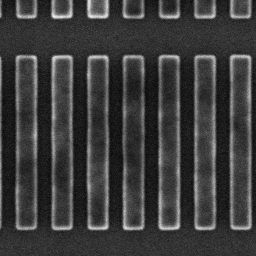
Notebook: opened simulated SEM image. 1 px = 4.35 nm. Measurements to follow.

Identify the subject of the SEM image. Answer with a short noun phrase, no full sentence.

groups of lines, slits or small figures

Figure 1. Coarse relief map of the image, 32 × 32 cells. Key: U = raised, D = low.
DDUUDDDUUDDUUDDDUUDDUUDDUUUDDUUD
DDUUDDDUUDDUUDDDUUDDUUDDUUUDDUUD
DDDDDDDDDDDDDDDDDDDDDDDDDDDDDDDD
DDDDDDDDDDDDDDDDDDDDDDDDDDDDDDDD
DDDDDDDDDDDDDDDDDDDDDDDDDDDDDDDD
DDDDDDDDDDDDDDDDDDDDDDDDDDDDDDDD
DDDDDDDDDDDDDDDDDDDDDDDDDDDDDDDD
DDUUDDDUUDDUUDDDUUDDUUDDUUUDDUUD
DDUUUDDUUDDUUDDDUUDDUUDDUUUDDUUD
DDUUUDDUUDDUUDDDUUDDUUDDUUUDDUUD
DDUUUDDUUDDUUDDDUUDDUUDDUUUDDUUD
DDUUUDDUUDDUUDDDUUDDUUDDUUUDDUUD
DDUUUDDUUDDUUDDDUUDDUUDDUUUDDUUD
DDUUDDDUUDDUUDDUUUDDUUDDUUUDDUUD
DDUUDDDUUDDUUDDDUUDDUUDDUUUDDUUD
DDUUUDDUUDDUUDDDUUDDUUDDUUUDDUUD
DDUUUDDUUDDUUDDUUUDDUUDDUUUDDUUD
DDUUDDDUUDDUUDDUUUDDUUDDUUUDDUUD
DDUUDDDUUDDUUDDUUUDDUUDDUUUDDUUD
DDUUDDDUUDDUUDDDUUDDUUDDUUUDDUUD
DDUUDDDUUDDUUDDDUUDDUUDDUUUDDUUD
DDUUUDDUUDDUUDDDUUDDUUDDUUUDDUUD
DDUUUDDUUDDUUDDDUUDDUUDDUUUDDUUD
DDUUUDDUUDDUUDDDUUDDUUDDUUUDDUUD
DDUUDDDUUDDUUDDDUUDDUUDDUUUDDUUD
DDUUUDDUUDDUUDDDUUDDUUDDUUUDDUUD
DDUUUDDUUDDUUDDDUUDDUUDDUUUDDUUD
DDUUUDDUUDDUUDDDUUDDUUDDUUUDDUUD
DDUUDDDUUDDUUDDDUUDDUUDDDUDDDUUD
DDDDDDDDDDDDDDDDDDDDDDDDDDDDDDDD
DDDDDDDDDDDDDDDDDDDDDDDDDDDDDDDD
DDDDDDDDDDDDDDDDDDDDDDDDDDDDDDDD